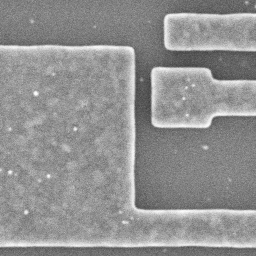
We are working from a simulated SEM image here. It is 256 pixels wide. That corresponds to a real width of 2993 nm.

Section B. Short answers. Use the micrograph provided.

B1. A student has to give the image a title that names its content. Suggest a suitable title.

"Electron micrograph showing wiring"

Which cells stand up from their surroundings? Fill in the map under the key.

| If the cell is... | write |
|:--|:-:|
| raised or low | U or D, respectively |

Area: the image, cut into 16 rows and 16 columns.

DDDDDDDDDDDDDDDD
DDDDDDDDDDUUUUUU
DDDDDDDDDDUUUUUU
UUUUUUUUDDDDDDDD
UUUUUUUUDDUUUDDD
UUUUUUUUDDUUUUUU
UUUUUUUUDDUUUUUU
UUUUUUUUDDUUUDDD
UUUUUUUUDDDDDDDD
UUUUUUUUDDDDDDDD
UUUUUUUUDDDDDDDD
UUUUUUUUDDDDDDDD
UUUUUUUUDDDDDDDD
UUUUUUUUUUUUUUUU
UUUUUUUUUUUUUUUU
DDDDDDDDDDDDDDDD